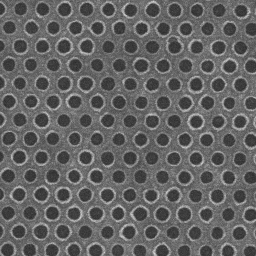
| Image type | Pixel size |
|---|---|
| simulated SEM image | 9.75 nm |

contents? a regular array of holes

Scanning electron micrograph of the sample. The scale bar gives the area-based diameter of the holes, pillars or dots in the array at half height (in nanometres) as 128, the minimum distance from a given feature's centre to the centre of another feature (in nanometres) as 207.